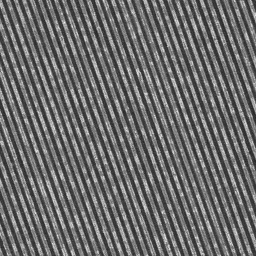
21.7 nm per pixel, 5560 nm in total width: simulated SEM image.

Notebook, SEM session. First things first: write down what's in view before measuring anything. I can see parallel lines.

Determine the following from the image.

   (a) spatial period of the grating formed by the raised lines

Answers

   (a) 165 nanometres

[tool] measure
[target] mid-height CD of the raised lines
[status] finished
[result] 76.9 nm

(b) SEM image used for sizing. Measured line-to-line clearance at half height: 97.3 nm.